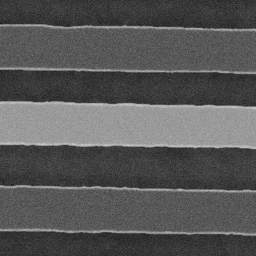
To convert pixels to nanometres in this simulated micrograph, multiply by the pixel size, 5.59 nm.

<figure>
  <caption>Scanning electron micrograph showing lines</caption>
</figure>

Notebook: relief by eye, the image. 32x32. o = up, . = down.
................................
................................
................................
oooooooooooooooooooooo..........
oooooooooooooooooooooooooooooooo
oooooooooooooooooooooooooooooooo
oooooooooooooooooooooooooooooooo
oooooooooooooooooooooooooooooooo
oooooooooooooooooooooooooooooooo
................................
................................
................................
................................
oooooooooooooooooooooooooooooooo
oooooooooooooooooooooooooooooooo
oooooooooooooooooooooooooooooooo
oooooooooooooooooooooooooooooooo
oooooooooooooooooooooooooooooooo
...............................o
................................
................................
................................
................................
ooooooooooooooo.................
oooooooooooooooooooooooooooooooo
oooooooooooooooooooooooooooooooo
oooooooooooooooooooooooooooooooo
oooooooooooooooooooooooooooooooo
oooooooooooooooooooooooooooooooo
................................
................................
................................